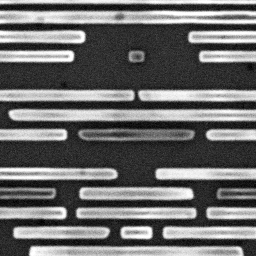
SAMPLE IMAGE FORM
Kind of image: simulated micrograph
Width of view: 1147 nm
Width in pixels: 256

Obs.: wiring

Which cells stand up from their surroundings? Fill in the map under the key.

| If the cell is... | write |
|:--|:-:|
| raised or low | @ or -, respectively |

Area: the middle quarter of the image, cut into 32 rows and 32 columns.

--------------------------------
--------------------------------
--------------------------------
--------------------------------
--------------------------------
--------------------------------
--------------------------------
@@@@@@@@@@@@@@@@@--@@@@@@@@@@@@@
@@@@@@@@@@@@@@@@@--@@@@@@@@@@@@@
--------------------------------
--------------------------------
--------------------------------
@@@@@@@@@@@@@@@@@@@@@@@@@@@@@@@@
@@@@@@@@@@@@@@@@@@@@@@@@@@@@@@@@
--------------------------------
--------------------------------
-----------@@@@@@---------------
----@@@@@@@@@@@@@@@@@@@@@@@@@@@@
----@@@@@@@@@@@@@@@@@@@@@@@@@@@@
--------------------------------
--------------------------------
--------------------------------
--------------------------------
--------------------------------
--------------------------------
--------------------------------
@@@@@@@@@@@@-----------@@@@@@@@@
@@@@@@@@@@@@@----------@@@@@@@@@
@@@@@@@@@@@@@----------@@@@@@@@@
--------------------------------
--------------------------------
----@@@@@@@@@@@@@@@@@@@@@@@@@@@@